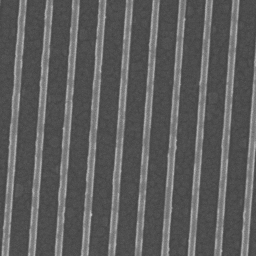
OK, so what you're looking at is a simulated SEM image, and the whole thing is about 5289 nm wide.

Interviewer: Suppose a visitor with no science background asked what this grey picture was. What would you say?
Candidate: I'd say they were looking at parallel lines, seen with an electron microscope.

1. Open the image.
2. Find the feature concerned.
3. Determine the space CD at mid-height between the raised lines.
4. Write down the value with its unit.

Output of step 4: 19.2 pixels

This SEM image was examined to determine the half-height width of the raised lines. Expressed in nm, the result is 149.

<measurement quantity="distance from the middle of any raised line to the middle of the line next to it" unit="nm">548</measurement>